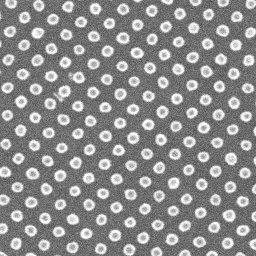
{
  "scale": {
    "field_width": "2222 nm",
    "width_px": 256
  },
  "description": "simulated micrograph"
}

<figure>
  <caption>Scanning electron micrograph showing a regular array of raised bodies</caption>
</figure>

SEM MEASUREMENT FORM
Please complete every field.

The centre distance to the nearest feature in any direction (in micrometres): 0.167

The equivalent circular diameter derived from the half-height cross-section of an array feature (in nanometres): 86.5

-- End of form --